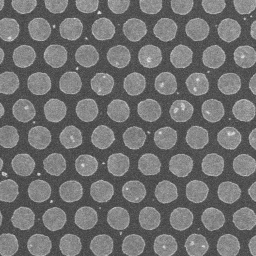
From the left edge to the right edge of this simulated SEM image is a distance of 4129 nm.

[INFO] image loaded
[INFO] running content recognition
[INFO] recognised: a regular array of raised bodies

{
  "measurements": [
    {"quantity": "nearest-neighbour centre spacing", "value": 498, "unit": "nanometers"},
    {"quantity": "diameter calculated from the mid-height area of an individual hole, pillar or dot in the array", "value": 360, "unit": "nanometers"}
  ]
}